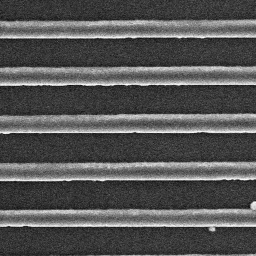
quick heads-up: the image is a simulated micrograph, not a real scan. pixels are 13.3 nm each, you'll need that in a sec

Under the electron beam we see lines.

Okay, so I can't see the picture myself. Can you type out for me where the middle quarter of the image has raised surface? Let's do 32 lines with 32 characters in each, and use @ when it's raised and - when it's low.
--------------------------------
@@@@@@@@@@@@@@@@@@@@@@@@@@@@@@@@
@@@@@@@@@@@@@@@@@@@@@@@@@@@@@@@@
@@@@@@@@@@@@@@@@@@@@@@@@@@@@@@@@
@@@@@@@@@@@@@@@@@@@@@@@@@@@@@@@@
--------------------------------
--------------------------------
--------------------------------
--------------------------------
--------------------------------
--------------------------------
--------------------------------
--------------------------------
@@@@@@@@@@@@@@@@@@@@@@@@@@@@@@@@
@@@@@@@@@@@@@@@@@@@@@@@@@@@@@@@@
@@@@@@@@@@@@@@@@@@@@@@@@@@@@@@@@
@@@@@@@@@@@@@@@@@@@@@@@@@@@@@@@@
--------------------------------
--------------------------------
--------------------------------
--------------------------------
--------------------------------
--------------------------------
--------------------------------
--------------------------------
@@@@@@@@@@@@@@@@@@@@@@@@@@@@@@@@
@@@@@@@@@@@@@@@@@@@@@@@@@@@@@@@@
@@@@@@@@@@@@@@@@@@@@@@@@@@@@@@@@
@@@@@@@@@@@@@@@@@@@@@@@@@@@@@@@@
--------------------------------
--------------------------------
--------------------------------